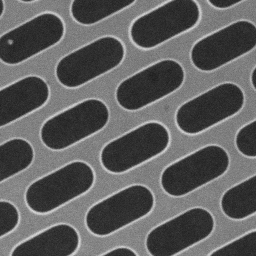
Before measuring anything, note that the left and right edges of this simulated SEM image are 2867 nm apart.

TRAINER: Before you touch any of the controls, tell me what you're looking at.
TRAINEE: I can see groups of lines, slits or small figures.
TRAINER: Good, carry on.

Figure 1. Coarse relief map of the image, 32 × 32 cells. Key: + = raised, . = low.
+++++++++.......+++++....+...+++
+++++++++......++++......+++++++
++++....+....++++........+++++++
++......++++++++........++++....
........++++++++......++++......
.......++++....++...++++........
.....++++.......++++++++.......+
...+++++.......+++++++++.....+++
+++++++.......++++.....++..+++++
+++++++.....+++++......+++++++++
+.....++..+++++........+++++.+++
......+++++++++.......++++....++
......+++++.+++.....++++......++
.....++++....++...+++++.......++
...++++.......++++++++.......+++
.+++++.......+++++..++.....++++.
+++++.......++++.....++..+++++..
+..++.....++++.......++++++++...
....++..+++++........++++...++..
....+++++++++.......+++.....+++.
....+++++..++.....+++........+++
..+++++.....++.+++++........++++
+++++.......++++++++.......++++.
++++.......+++++..++.....++++...
+++.......++++.....+++.+++++....
.++.....++++.......+++++++++....
..++..+++++........++++...++....
..+++++++++......++++......+++++
..++++...++....++++........+++++
++++......+++++++++.......++++..
++........++++++++......++++....
++.......+++++...++....++++.....